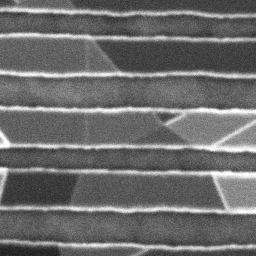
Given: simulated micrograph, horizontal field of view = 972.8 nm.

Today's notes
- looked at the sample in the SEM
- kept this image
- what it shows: lines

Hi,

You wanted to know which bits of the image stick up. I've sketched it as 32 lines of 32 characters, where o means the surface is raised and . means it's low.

oooooooooooooooooooooooooooooooo
......oooooooooooooooooooooooooo
................................
................................
ooooooooo.......................
oooooooooooooooooooooooooooooooo
oooooooooooooooooooooooooooooooo
oooooooooooooooooooooooooooooooo
oooooooooooooooooooooooooooooooo
.....oooo.......oo.........ooooo
................................
................................
................................
oooooo..........o...............
oooooooooooooooooooooooooooooooo
oooooooooooooooooooooooooooooooo
oooooooooooooooooooooooooooooooo
oooooooooooooooooooooooooooooooo
..........ooo........oo.oooooooo
................................
................................
oooooooooooooooooo...o..........
oooooooooooooooooooooooooooooooo
oooooooooooooooooooooooooooooooo
oooooooooooooooooooooooooooooooo
oooooooooooooooooooooooooooooooo
...........................ooooo
................................
................................
................................
oooooooo........................
oooooooooooooooooooooooooooooooo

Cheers